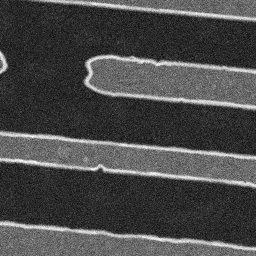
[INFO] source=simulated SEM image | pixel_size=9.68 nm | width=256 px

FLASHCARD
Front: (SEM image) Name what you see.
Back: one or a few lines or trenches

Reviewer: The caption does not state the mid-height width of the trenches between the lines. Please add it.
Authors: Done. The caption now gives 51.4 px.